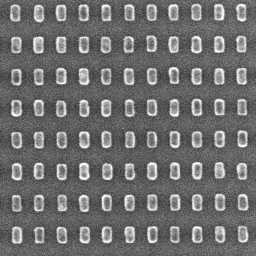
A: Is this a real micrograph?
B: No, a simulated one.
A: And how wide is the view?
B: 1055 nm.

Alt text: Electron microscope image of a regular array of raised bodies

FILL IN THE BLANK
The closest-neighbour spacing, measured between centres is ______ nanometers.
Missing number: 92.2